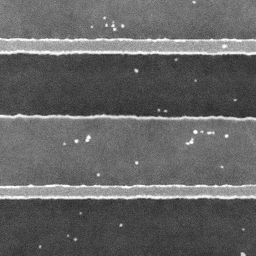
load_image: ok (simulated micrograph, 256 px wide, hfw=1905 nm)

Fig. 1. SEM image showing lines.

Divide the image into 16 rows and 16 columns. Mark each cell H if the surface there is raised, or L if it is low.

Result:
HHHHHHHHHHHHHHHH
HHHHHHHHHHHHHHHH
HHHHHHHHHHHHHHHH
LLLLLLLLLLLLLLLL
LLLLLLLLLLLLLLLL
LLLLLLLLLLLLLLLL
LLLLLLLLLLLLLLLL
HHHHHHHHHHHHHHHH
HHHHHHHHHHHHHHHH
HHHHHHHHHHHHHHHH
HHHHHHHHHHHHHHHH
HHHHHHHHHHHHHHHH
LLLLLLLLLLLLLLLL
LLLLLLLLLLLLLLLL
LLLLLLLLLLLLLLLL
LLLLLLLLLLLLLLLL